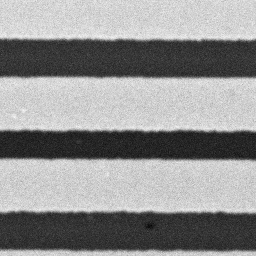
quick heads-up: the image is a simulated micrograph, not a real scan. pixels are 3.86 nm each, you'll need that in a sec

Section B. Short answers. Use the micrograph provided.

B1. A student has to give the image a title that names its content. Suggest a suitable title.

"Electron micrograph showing lines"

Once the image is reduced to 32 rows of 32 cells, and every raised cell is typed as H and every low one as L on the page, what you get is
HHHHHHHHHHHHHHHHHHHHHHHHHHHHHHHH
HHHHHHHHHHHHHHHHHHHHHHHHHHHHHHHH
HHHHHHHHHHHHHHHHHHHHHHHHHHHHHHHH
HHHHHHHHHHHHHHHHHHHHHHHHHHHHHHHH
HHHHHHHHHHHHHHHHHHHHHHHHHHHHHHHH
LLLLLLLLLLLLLLLLLLLLLLLLLLLLLLLL
LLLLLLLLLLLLLLLLLLLLLLLLLLLLLLLL
LLLLLLLLLLLLLLLLLLLLLLLLLLLLLLLL
LLLLLLLLLLLLLLLLLLLLLLLLLLLLLLLL
LLLLLLLLLLLLLLLLLLLLLLLLLLLLLLLL
HHHHHHHHHHHHHHHHHHHHHHHHHHHHHHHH
HHHHHHHHHHHHHHHHHHHHHHHHHHHHHHHH
HHHHHHHHHHHHHHHHHHHHHHHHHHHHHHHH
HHHHHHHHHHHHHHHHHHHHHHHHHHHHHHHH
HHHHHHHHHHHHHHHHHHHHHHHHHHHHHHHH
HHHHHHHHHHHHHHHHHHHHHHHHHHHHHHHH
LLLLLLLLLLLLLLLLLLLLLLLLLLLLLLLL
LLLLLLLLLLLLLLLLLLLLLLLLLLLLLLLL
LLLLLLLLLLLLLLLLLLLLLLLLLLLLLLLL
LLLLLLLLLLLLLLLLLLLLLLLLLLLLLLLL
HHHHHHHHHHHHHHHHHHHHHHHHHHHHHHHH
HHHHHHHHHHHHHHHHHHHHHHHHHHHHHHHH
HHHHHHHHHHHHHHHHHHHHHHHHHHHHHHHH
HHHHHHHHHHHHHHHHHHHHHHHHHHHHHHHH
HHHHHHHHHHHHHHHHHHHHHHHHHHHHHHHH
HHHHHHHHHHHHHHHHHHHHHHHHHHHHHHHH
HLLLHLLLLHLHLLLLHHLHHHHHHHHLHHHH
LLLLLLLLLLLLLLLLLLLLLLLLLLLLLLLL
LLLLLLLLLLLLLLLLLLLLLLLLLLLLLLLL
LLLLLLLLLLLLLLLLLLLLLLLLLLLLLLLL
LLLLLLLLLLLLLLLLLLLLLLLLLLLLLLLL
HHHHHHHHHHHHHHHHHHHHHHHHHHHHHHHH